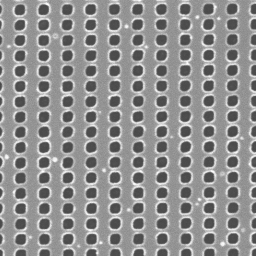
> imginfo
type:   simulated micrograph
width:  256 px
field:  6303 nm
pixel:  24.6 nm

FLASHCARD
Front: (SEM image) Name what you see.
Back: a regular array of holes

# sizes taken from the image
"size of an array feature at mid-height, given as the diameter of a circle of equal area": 287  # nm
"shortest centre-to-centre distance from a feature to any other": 0.372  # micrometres